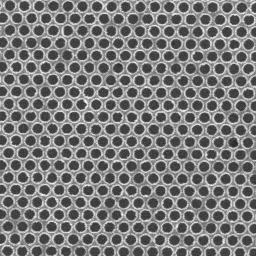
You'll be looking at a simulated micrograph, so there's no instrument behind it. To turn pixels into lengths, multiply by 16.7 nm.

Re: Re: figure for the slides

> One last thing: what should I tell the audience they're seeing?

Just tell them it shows a regular array of holes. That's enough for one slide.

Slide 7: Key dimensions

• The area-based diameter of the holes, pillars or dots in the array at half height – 178 nm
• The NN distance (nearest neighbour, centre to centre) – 14 pixels